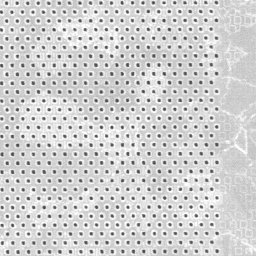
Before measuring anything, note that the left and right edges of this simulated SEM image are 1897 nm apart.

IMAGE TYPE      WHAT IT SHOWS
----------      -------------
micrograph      a regular array of holes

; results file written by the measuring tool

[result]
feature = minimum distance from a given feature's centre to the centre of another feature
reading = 74.6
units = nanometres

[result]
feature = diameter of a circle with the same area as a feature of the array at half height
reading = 32.4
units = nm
